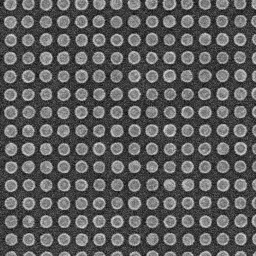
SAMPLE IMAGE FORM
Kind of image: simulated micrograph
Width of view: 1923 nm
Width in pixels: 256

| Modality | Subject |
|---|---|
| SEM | a regular array of raised bodies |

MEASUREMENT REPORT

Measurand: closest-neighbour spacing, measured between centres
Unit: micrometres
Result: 0.131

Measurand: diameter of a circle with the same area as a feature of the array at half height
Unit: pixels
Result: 11.8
